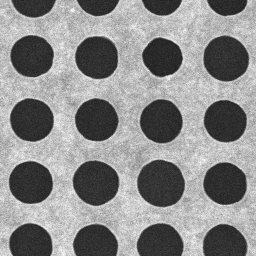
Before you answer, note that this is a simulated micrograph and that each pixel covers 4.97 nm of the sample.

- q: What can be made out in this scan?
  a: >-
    a regular array of holes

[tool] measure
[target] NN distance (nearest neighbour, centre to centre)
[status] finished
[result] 311 nm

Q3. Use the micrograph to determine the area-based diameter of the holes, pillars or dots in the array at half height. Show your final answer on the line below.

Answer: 214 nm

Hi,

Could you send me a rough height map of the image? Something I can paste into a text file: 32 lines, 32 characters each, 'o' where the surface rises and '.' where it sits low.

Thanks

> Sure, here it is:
oo.....ooo.....ooo.....ooo.....o
oo....ooooo...ooooo...ooooo...oo
oooooooooooooooooooooooooooooooo
oooooooooooooooooooooooooooooooo
ooo..ooooooooooooooooooooooooooo
oo....oooo....ooooo...oooo....oo
o......ooo.....ooo.....oo......o
o......oo......ooo.....oo......o
oo....oooo.....ooo....oooo.....o
ooo..oooooo...oooooo.ooooo....oo
oooooooooooooooooooooooooooooooo
oooooooooooooooooooooooooooooooo
ooo..oooooo..ooooooooooooooooooo
oo....oooo....oooo....oooo....oo
o......oo......ooo.....ooo.....o
o......oo......ooo.....ooo.....o
oo....oooo....oooo....oooo....oo
ooo..oooooo..oooooo...ooooo..ooo
oooooooooooooooooooooooooooooooo
oooooooooooooooooooooooooooooooo
ooo..ooooo...ooooo....ooooo..ooo
oo....ooo......oo......ooo....oo
o......oo......oo......oo......o
o......oo......oo......oo......o
oo....oooo....oooo.....ooo....oo
ooooooooooo..oooooo...ooooo..ooo
oooooooooooooooooooooooooooooooo
oooooooooooooooooooooooooooooooo
oo...ooooo...ooooo....ooooo..ooo
o.....ooo.....ooo.....oooo....oo
o......oo......oo......oo......o
o......oo......oo......oo......o